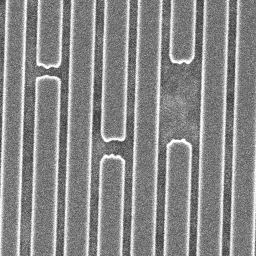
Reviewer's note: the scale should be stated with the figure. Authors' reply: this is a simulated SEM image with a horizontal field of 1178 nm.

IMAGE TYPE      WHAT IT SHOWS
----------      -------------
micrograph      parallel lines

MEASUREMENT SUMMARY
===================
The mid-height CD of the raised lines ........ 24.3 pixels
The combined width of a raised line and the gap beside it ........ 153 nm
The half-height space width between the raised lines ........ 42.5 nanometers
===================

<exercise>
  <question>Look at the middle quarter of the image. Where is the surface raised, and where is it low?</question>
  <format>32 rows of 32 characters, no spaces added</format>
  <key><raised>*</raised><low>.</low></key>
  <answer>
.******...******..******........
..*****...******..******........
.******...******..******........
.******...******..******........
.******...******..******........
.******...******..******........
.******...******..******........
.******...******..******........
.******...*****...******........
.******...*****...******........
.******...*****...******........
.******...*****...******........
.******...*****...******........
.******..******...******........
.******..******...******........
.******..******...******........
.******..******...*****.........
.******..******...*****.........
.******...*****...*****.........
.******...........*****....****.
.******..........******...******
.******..........******...******
.******...........*****...******
.******...****....*****...******
.******..******...*****...******
.******..******...*****...******
.******..******...*****...******
.******..******..******...******
.*****...******..******...******
.*****...******..******...******
.*****...******..******...*****.
.*****...******..******...*****.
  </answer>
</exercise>